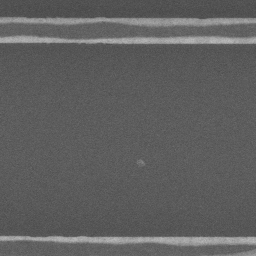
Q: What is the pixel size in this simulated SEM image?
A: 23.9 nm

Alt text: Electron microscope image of lines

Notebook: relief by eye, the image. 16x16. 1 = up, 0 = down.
0000000000000000
1111111111111111
1111111111111111
0000000000000000
0000000000000000
0000000000000000
0000000000000000
0000000000000000
0000000000000000
0000000000000000
0000000000000000
0000000000000000
0000000000000000
0000000000000000
0000000000000000
1111111111111111